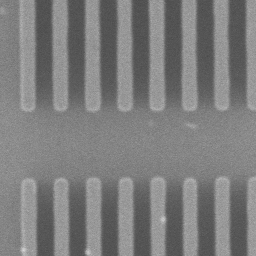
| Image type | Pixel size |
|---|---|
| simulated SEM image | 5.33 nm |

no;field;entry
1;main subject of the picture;groups of lines, slits or small figures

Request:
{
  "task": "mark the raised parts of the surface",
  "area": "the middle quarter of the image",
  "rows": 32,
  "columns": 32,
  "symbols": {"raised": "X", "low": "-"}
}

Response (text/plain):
X-----XXX----XXXX-----XXX-----XX
X-----XXX----XXXX-----XXX-----XX
X-----XXX----XXXX-----XXX-----XX
X----XXXX----XXXX-----XXX-----XX
X----XXXX----XXXX----XXXX-----XX
X-----XXX----XXXX----XXXX-----XX
X-----XXX----XXXX----XXXX-----XX
X-----XXX----XXXX----XXXX-----XX
X-----XXX----XXXX----XXXX-----XX
X-----XXX----XXXX-----XXX-----XX
X-----XXX----XXXX-----XXX-----XX
--------------------------------
--------------------------------
--------------------------------
--------------------------------
--------------------------------
--------------------------------
--------------------------------
--------------------------------
--------------------------------
--------------------------------
--------------------------------
--------------------------------
--------------------------------
--------------------------------
--------------------------------
--------------------------------
--------------------------------
--------------------------------
X-----XXX-----XXX-----XXX-----XX
X-----XXX-----XXX-----XXX-----XX
X-----XXX-----XXX-----XXX-----XX